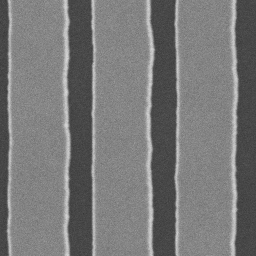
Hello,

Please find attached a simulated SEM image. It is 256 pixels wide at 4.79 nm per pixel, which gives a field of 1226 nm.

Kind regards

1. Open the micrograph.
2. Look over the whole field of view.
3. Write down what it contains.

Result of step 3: lines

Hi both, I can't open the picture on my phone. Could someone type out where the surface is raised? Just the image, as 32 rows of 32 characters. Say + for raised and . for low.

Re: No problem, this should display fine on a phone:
.+++++++....+++++++...+++++++...
.++++++++...+++++++...+++++++...
.++++++++...+++++++...+++++++...
.++++++++...+++++++...+++++++...
.++++++++...+++++++...+++++++...
.++++++++...+++++++...+++++++...
.++++++++...+++++++...+++++++...
.++++++++...+++++++...++++++++..
.++++++++...+++++++...+++++++...
.+++++++....+++++++...++++++++..
.+++++++....+++++++...++++++++..
.++++++++...+++++++...++++++++..
.+++++++....+++++++...++++++++..
.++++++++...+++++++...++++++++..
.++++++++...+++++++...++++++++..
.++++++++...+++++++...++++++++..
.++++++++...+++++++...++++++++..
.++++++++...+++++++...+++++++...
.++++++++...+++++++...+++++++...
.++++++++...+++++++...+++++++...
.++++++++...+++++++...+++++++...
.++++++++...+++++++...+++++++...
.++++++++...+++++++...+++++++...
.++++++++...+++++++...++++++++..
.++++++++...+++++++...++++++++..
.++++++++...+++++++...+++++++...
.++++++++...+++++++...++++++++..
.++++++++...+++++++...+++++++...
.+++++++....+++++++...+++++++...
.++++++++...+++++++...+++++++...
.++++++++...+++++++...+++++++...
.++++++++...+++++++...+++++++...